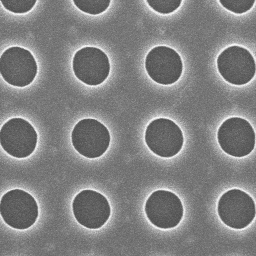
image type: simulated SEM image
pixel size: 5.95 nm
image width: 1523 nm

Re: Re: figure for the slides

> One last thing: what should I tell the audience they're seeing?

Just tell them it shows holes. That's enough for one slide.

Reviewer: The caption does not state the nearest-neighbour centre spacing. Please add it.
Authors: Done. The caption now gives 425 nm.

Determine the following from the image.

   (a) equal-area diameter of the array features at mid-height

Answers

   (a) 231 nanometers